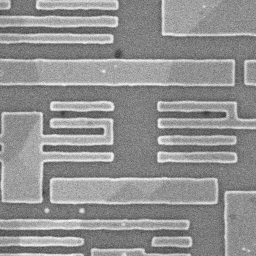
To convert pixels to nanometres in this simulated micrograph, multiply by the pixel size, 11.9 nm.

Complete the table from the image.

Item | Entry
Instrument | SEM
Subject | wiring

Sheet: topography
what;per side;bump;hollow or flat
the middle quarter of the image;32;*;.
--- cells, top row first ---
********************************
********************************
********************************
********************************
********************************
................................
................................
................................
................................
........***.............*...****
************............********
..*****..***............********
................................
................................
************............********
************............********
..........**....................
..........**....................
************............********
************............********
................................
................................
************............********
************............********
................................
................................
................................
................................
................................
********************************
********************************
********************************